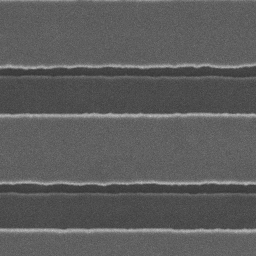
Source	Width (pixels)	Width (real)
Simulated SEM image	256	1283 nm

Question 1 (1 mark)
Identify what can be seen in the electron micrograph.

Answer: lines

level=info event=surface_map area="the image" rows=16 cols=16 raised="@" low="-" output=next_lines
@@@@@@@@@@@@@@@@
@@@@@@@@@@@@@@@@
@@@@@@@@@@@@@@@@
@@@@@@@@@@@@@@@@
----------------
----------------
----------------
@@@@@@@@@@@@@@@@
@@@@@@@@@@@@@@@@
@@@@@@@@@@@@@@@@
@@@@@@@@@@@@@@@@
@-@@@@@@@-@@@@@@
----------------
----------------
@@@@@@@@@@@@@@@@
@@@@@@@@@@@@@@@@